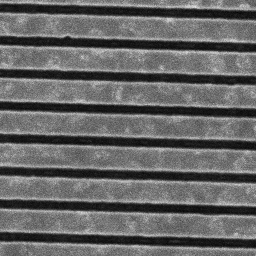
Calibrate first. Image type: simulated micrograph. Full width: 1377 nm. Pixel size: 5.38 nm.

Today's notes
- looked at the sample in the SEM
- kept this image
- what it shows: parallel lines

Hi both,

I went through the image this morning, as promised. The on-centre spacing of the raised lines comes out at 0.175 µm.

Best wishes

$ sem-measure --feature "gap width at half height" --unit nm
48.4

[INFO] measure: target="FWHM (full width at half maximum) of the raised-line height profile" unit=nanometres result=129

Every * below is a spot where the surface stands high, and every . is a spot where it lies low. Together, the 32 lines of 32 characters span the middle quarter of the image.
********************************
********************************
...............................*
................................
****************................
********************************
********************************
********************************
********************************
********************************
.........................***.***
................................
********........................
********************************
********************************
********************************
********************************
********************************
.........................*******
................................
********........................
********************************
********************************
********************************
********************************
********************************
................****************
................................
................................
********************************
********************************
********************************